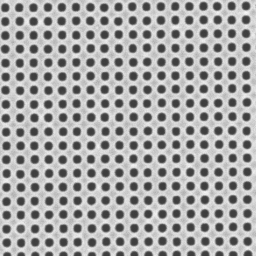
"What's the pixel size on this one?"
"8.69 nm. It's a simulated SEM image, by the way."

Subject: a regular array of holes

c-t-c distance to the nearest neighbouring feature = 118 nm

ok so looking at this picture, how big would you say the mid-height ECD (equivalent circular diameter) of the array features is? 0.0785 µm